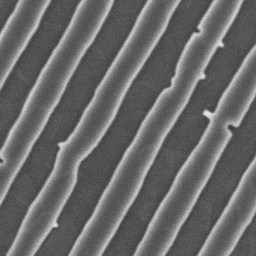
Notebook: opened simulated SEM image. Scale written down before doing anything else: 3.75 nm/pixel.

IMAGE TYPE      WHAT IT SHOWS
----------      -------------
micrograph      parallel lines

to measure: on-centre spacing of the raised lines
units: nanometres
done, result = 212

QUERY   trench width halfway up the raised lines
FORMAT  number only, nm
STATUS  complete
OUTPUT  106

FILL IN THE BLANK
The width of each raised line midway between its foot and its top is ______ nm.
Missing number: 103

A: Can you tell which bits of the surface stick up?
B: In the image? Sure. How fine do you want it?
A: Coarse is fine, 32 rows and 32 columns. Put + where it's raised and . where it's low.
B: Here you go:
..++++....++++....++++.....+++..
..+++....+++++....++++....++++..
.++++....++++....++++....++++...
+++++...++++.....++++....+++....
++++....++++....++++....++++....
+++....++++.....+++....+++++....
+++....++++....++++....++++....+
++....++++....++++....++++.....+
++...+++++....++++....++++....++
+....++++....++++.....++++...+++
....++++....++++.....++++....+++
....++++....++++....++++....++++
...++++....++++.....++++....++++
...++++....++++....++++....++++.
..++++....++++....++++....++++..
..++++....++++....++++....++++..
.++++....++++....++++.....+++...
.++++...+++++....+++.....++++...
++++...+++++....++++....++++....
+++....++++....++++.....++++....
+++....+++.....++++....++++....+
++.....+++....++++....+++++....+
++....++++....++++....++++....++
+....++++....++++....++++.....++
+....++++....++++....++++....+++
....++++....++++....++++.....+++
...++++.....++++....++++....++++
...++++....++++....++++....++++.
...++++....++++....+++.....++++.
..++++....++++....++++....++++..
..+++....++++....++++.....++++..
.+++.....++++....++++....++++...